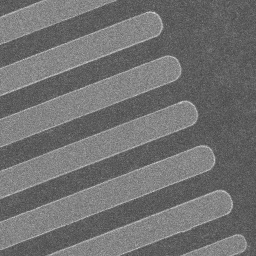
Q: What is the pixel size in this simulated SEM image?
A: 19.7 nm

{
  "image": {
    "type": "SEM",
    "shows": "parallel lines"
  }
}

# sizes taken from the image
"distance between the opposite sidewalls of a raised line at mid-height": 0.506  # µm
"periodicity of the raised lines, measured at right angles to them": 938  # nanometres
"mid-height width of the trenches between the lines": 432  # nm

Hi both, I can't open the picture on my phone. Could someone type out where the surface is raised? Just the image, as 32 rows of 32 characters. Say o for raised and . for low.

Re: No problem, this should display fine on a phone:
....ooooooooo...................
..ooooooooo.....................
oooooooo........oooo............
ooooo........ooooooo............
ooo........oooooooo.............
........ooooooooo...............
.....ooooooooo..................
...ooooooooo.......ooo..........
ooooooooo........oooooo.........
oooooo........oooooooo..........
oooo........ooooooooo...........
o........ooooooooo..............
......oooooooooo................
....ooooooooo........ooo........
.ooooooooo........ooooooo.......
oooooooo.......ooooooooo........
ooooo........ooooooooo..........
oo........ooooooooo.............
........oooooooo........oo......
.....ooooooooo........ooooo.....
..ooooooooo........oooooooo.....
ooooooooo.......oooooooooo......
oooooo........ooooooooo.........
ooo........ooooooooo............
o........ooooooooo.......oooo...
......ooooooooo........oooooo...
...oooooooooo.......ooooooooo...
.ooooooooo........ooooooooo.....
ooooooo........ooooooooo........
ooooo.......ooooooooo........o..
oo........ooooooooo.......ooooo.
.......ooooooooo........oooooo..